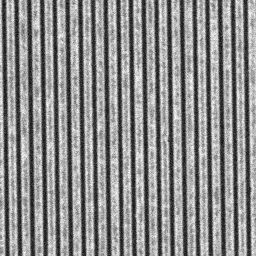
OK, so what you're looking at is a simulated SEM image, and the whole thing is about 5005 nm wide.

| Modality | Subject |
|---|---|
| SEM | parallel lines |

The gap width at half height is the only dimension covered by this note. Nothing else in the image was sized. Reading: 127 nm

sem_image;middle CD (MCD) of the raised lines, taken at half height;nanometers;127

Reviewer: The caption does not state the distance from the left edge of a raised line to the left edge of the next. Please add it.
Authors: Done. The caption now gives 249 nanometres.